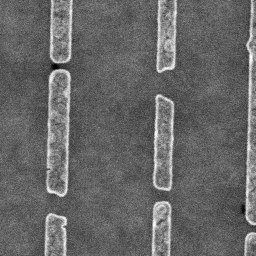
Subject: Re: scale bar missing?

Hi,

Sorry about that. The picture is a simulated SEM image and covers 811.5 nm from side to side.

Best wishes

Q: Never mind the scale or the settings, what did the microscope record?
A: one or a few lines or trenches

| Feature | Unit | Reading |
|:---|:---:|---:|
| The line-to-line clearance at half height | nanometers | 247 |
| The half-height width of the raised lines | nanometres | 58.7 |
